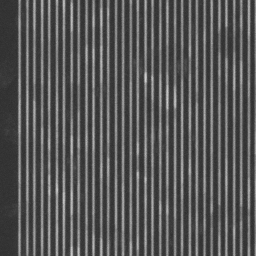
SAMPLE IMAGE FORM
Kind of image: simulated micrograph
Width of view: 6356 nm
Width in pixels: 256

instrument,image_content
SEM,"parallel lines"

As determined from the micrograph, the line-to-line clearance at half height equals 152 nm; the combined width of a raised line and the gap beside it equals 184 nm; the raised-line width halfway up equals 31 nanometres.